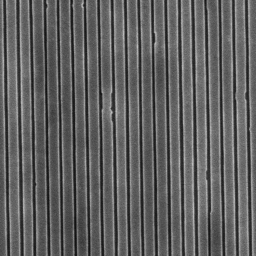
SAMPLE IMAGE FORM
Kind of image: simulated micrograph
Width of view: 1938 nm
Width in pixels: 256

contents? parallel lines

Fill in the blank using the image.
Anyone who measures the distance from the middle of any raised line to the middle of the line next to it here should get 102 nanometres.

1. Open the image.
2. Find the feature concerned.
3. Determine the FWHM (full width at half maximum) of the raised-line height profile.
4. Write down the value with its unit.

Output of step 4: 77.5 nm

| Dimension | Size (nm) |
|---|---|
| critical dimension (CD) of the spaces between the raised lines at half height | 28.4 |